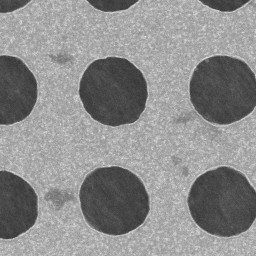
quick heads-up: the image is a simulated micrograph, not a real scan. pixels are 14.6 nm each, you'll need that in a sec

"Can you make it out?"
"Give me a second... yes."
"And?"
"holes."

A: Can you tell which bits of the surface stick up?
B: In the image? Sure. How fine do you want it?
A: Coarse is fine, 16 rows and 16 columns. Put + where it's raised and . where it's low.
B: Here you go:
.+++++..+++++..+
++++++++++++++++
++++++++++++++++
++++++++++++++++
..+++....+++....
..+++....+++....
..+++....+++....
.+++++..+++++..+
++++++++++++++++
++++++++++++++++
++++++..++++++++
..+++....+++....
..+++....+++....
..+++....+++....
..++++..+++++..+
++++++++++++++++